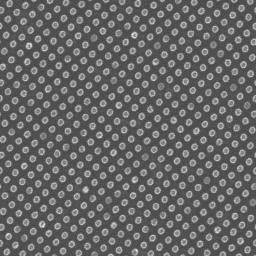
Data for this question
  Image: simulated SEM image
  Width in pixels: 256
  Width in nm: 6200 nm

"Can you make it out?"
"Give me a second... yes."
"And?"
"a regular array of raised bodies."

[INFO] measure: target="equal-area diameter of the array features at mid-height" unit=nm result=157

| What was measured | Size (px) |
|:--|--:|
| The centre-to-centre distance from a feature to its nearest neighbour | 11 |